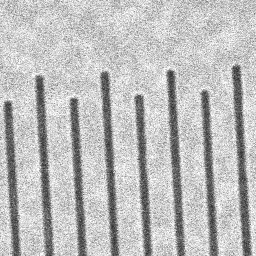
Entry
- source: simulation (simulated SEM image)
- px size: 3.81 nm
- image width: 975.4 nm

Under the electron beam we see parallel lines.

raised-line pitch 32.9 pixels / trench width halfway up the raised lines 37.1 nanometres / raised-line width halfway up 85.6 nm